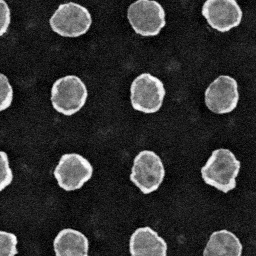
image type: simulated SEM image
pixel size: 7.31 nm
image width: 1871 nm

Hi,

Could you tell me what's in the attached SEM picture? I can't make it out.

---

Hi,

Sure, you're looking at raised bodies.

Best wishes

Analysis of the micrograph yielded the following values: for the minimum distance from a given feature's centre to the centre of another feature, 540 nanometers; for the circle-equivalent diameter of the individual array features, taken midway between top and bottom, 258 nm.